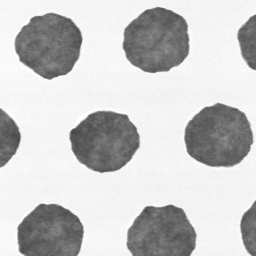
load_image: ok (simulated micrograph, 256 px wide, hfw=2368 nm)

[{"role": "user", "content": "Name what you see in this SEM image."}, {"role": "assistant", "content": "holes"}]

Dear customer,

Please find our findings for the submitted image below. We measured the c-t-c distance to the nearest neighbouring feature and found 1010 nm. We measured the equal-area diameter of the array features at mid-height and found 608 nanometres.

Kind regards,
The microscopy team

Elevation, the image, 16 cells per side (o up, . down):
oooooooooooooooo
oo...ooo....ooo.
o....ooo....ooo.
o....ooo....ooo.
oo..ooooo.oooooo
oooooooooooooooo
oooooooooooooooo
.oooo...oooo...o
.ooo.....ooo....
.oooo...oooo....
oooooo..oooooooo
oooooooooooooooo
oooooooooooooooo
oo...oooo...ooo.
o....ooo....ooo.
o....ooo....ooo.